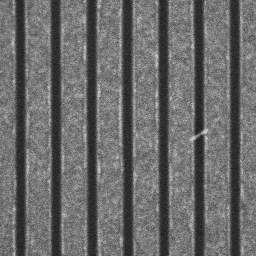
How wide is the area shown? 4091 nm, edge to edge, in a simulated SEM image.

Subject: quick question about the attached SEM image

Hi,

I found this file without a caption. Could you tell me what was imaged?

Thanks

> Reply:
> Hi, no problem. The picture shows parallel lines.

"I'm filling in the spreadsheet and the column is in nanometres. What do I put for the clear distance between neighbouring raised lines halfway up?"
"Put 160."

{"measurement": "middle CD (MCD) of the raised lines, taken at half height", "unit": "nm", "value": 415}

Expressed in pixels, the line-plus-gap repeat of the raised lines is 35.8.